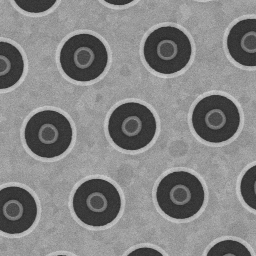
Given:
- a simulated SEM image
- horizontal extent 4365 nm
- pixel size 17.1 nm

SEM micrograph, an array of small figures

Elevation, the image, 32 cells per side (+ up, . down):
++.....++++++...++++++++++++++++
+++...++++++++++++++++++++++++++
++++++++++++++++++++++++++++++..
+++++++++++++++++++....++++++...
+++++++++...++++++......++++...+
..++++++.....+++++..++..++++..++
...++++...+...++++..++..++++....
+..++++..++...++++......+++++...
+..+++++.....++++++....++++++++.
...+++++.....+++++++++++++++++++
..++++++++++++++++++++++++++++++
++++++++++++++++++++++++++++++++
+++++++++++++++++++++++++....+++
++++++++++++++.....+++++......++
++++....++++++......++++..++..++
+++......++++...+...++++..++..++
+++..++..++++...+...++++......++
+++..++..+++++.....++++++....+++
+++......++++++...++++++++++++++
++++....++++++++++++++++++++++++
++++++++++++++++++++++++++++++++
+++++++++++++++++++++...++++++..
++++++++++....++++++.....+++++..
...++++++......++++...+...++++..
....+++++..++..++++..+++..++++..
.+...++++..++..+++++......+++++.
.++..++++......+++++.....+++++++
.....+++++.....+++++++.+++++++++
....++++++++.+++++++++++++++++++
++++++++++++++++++++++++++++++++
+++++++++++++++++++++++++++....+
++++++++++++++++....++++++.....+